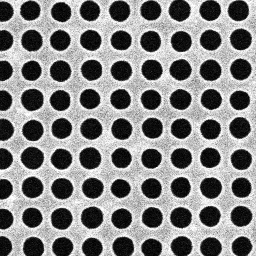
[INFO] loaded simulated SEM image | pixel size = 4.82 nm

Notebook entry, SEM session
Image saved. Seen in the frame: a regular array of holes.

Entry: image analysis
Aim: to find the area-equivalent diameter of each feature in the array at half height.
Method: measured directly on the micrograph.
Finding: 101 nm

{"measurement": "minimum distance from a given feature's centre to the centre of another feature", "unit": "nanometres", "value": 138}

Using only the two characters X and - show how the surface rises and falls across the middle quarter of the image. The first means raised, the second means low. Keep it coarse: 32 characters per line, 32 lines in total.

-XXX-----XXX-----XX-----XX------
--XX------XX-----XX------X------
--XXX-----XX-----XXX-----XX-----
-XXXX----XXX----XXXX----XXXX---X
XXXXXXXXXXXXXXXXXXXXXXXXXXXXXXXX
XXXXXXXXXXXXXXXXXXXXXXXXXXXXXXXX
XXXXX---XXXXX--XXXXXXXXXXXXX--XX
-XXX----XXXX----XXXX----XXX-----
--XX-----XX------XX-----XX------
--XX-----XXX-----XX-----XX------
-XXXX---XXXX----XXXX----XXX----X
XXXXXXXXXXXXXXXXXXXXX-XXXXXXXXXX
XXXXXXXXXXXXXXXXXXXXXXXXXXXXXXXX
XXXXXXXXXXXXXXXXXXXXXX-XXXXXX-XX
-XXXX----XXX----XXXX----XXX----X
--XX-----XXX-----XXX-----XX-----
--XX------XX-----XXX-----X------
--XX-----XXX-----XXX----XXX----X
XXXXX---XXXXX---XXXXXX-XXXXX--XX
XXXXXXXXXXXXXXXXXXXXXXXXXXXXXXXX
XXXXXXXXXXXXXXXXXXXXXXXXXXXXXXXX
-XXXX---XXXXX---XXXX---XXXXX---X
--XX-----XXX-----XXX----XXX-----
--XX-----XXX-----XX------XX-----
--XX-----XXX-----XX-----XXX-----
-XXXX----XXXX---XXXX----XXXX---X
XXXXXXXXXXXXXXXXXXXXXXXXXXXXXXXX
XXXXXXXXXXXXXXXXXXXXXXXXXXXXXXXX
XXXXXXX-XXXXXXXXXXXXXXXXXXXXX-XX
--XXX----XXX----XXXX----XXX----X
--XXX-----XX----XXX-----XXX-----
--XXX-----XX----XXX-----XXX-----